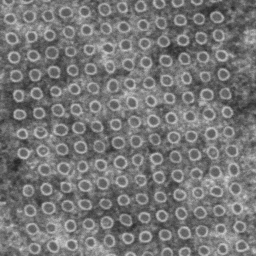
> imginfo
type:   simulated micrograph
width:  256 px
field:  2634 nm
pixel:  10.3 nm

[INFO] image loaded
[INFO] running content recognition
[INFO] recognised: a regular array of raised bodies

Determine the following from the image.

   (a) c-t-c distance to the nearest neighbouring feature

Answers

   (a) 0.189 micrometres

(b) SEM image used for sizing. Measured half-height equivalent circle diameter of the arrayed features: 0.108 um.